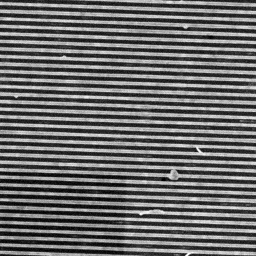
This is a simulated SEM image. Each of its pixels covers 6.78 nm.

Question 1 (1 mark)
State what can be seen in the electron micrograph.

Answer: parallel lines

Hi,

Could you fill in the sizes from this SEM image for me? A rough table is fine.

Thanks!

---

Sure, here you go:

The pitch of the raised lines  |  51.1 nm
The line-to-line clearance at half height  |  35.5 nanometers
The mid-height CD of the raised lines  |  0.0152 µm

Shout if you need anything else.